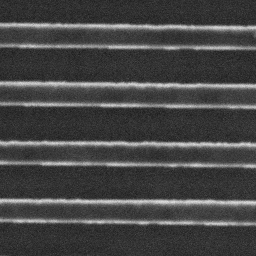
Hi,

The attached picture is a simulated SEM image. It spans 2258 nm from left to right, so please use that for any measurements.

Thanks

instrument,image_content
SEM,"lines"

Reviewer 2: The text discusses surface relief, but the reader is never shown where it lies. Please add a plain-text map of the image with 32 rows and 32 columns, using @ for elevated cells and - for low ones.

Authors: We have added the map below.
--------------------------------
--------------------------------
--------------------------------
@@@@@@@@@@@@@@@@@@@@@@@@@@@@@@@@
@@@@@@@@@@@@@@@@@@@@@@@@@@@@@@@@
@@@@@@@@@@@@@@@@@@@@@@@@@@@@@@@@
--------------------------------
--------------------------------
--------------------------------
--------------------------------
@@@@@@@@@@-@@@--@---------------
@@@@@@@@@@@@@@@@@@@@@@@@@@@@@@@@
@@@@@@@@@@@@@@@@@@@@@@@@@@@@@@@@
--------------------------------
--------------------------------
--------------------------------
--------------------------------
--------------------------------
@@@@@@@@@@@@@@@@@@@@@@@@@@@@@@@@
@@@@@@@@@@@@@@@@@@@@@@@@@@@@@@@@
-----@@@@@@@@@@@@@@@@@@@@@@@@@@@
--------------------------------
--------------------------------
--------------------------------
--------------------------------
@@@@@@@@@@@@@@@@@@@@@@@@@@@@@@@@
@@@@@@@@@@@@@@@@@@@@@@@@@@@@@@@@
@@@@@@@@@@@@@@@@@@@@@@@@@@@@@@@@
--------------------------------
--------------------------------
--------------------------------
--------------------------------